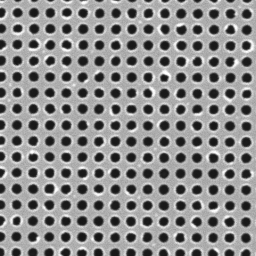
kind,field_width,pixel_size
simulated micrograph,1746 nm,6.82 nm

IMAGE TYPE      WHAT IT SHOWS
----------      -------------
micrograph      a regular array of holes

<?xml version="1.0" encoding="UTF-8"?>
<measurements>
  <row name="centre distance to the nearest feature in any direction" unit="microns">0.108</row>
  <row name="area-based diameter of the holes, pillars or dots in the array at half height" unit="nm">69.3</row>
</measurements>